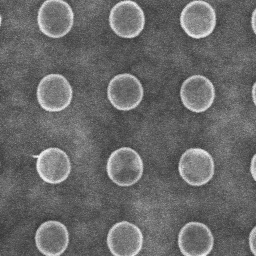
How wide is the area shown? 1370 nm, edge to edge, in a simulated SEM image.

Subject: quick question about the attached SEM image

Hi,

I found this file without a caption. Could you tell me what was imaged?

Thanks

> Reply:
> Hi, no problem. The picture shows a regular array of raised bodies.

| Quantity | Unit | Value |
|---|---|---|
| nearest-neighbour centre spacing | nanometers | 381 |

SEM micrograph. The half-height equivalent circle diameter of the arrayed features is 0.183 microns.